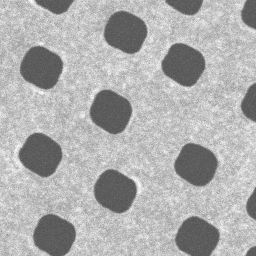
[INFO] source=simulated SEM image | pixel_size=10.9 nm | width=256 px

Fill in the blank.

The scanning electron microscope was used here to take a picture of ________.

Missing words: holes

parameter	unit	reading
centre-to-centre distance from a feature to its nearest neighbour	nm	870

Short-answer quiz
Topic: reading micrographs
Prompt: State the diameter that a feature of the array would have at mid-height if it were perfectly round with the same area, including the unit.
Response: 464 nanometres